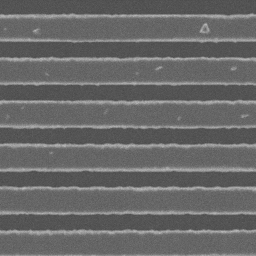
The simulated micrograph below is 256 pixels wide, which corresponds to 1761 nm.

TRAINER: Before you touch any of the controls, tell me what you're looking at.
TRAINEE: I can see lines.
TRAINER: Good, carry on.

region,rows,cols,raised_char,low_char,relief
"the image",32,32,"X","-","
--------------------------------
--------------------------------
XXXXXXXXXXXXXXXXXXXXXXXXXXXXXXXX
XXXXXXXXXXXXXXXXXXXXXXXXXXXXXXXX
XXXXXXXXXXXXXXXXXXXXXXXXXXXXXXXX
--------------------------------
--------------------------------
XXXXXXXXXXXXXXXXXXXXXXXXXXXXXXXX
XXXXXXXXXXXXXXXXXXXXXXXXXXXXXXXX
XXXXXXXXXXXXXXXXXXXXXXXXXXXXXXXX
XXXXXXXXXXXXXXXXXXXXXXXXXXXXXXXX
--------------------------------
--------------------------------
XXXXXXXXXXXXXXXXXXXXXXXXXXXXXXXX
XXXXXXXXXXXXXXXXXXXXXXXXXXXXXXXX
XXXXXXXXXXXXXXXXXXXXXXXXXXXXXXXX
--------------------------------
--------------------------------
XXXXXXXXXXXXXXXXXXXXXXXXXXXXXXXX
XXXXXXXXXXXXXXXXXXXXXXXXXXXXXXXX
XXXXXXXXXXXXXXXXXXXXXXXXXXXXXXXX
--------------------------------
--------------------------------
XX-XXXXXXX-XX--X--X--X--XX---XX-
XXXXXXXXXXXXXXXXXXXXXXXXXXXXXXXX
XXXXXXXXXXXXXXXXXXXXXXXXXXXXXXXX
XXXXXXXXXXXXXXXXXXXXXXXXXXXXXXXX
--------------------------------
--------------------------------
XXXXXXXXXXXXXXXXXXXXXXXXXXXXXXXX
XXXXXXXXXXXXXXXXXXXXXXXXXXXXXXXX
XXXXXXXXXXXXXXXXXXXXXXXXXXXXXXXX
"